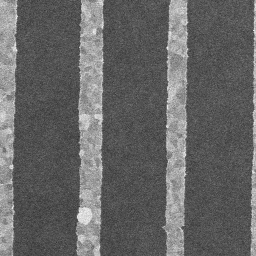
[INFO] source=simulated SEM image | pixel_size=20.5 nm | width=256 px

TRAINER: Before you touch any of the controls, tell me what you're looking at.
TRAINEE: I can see one or a few lines or trenches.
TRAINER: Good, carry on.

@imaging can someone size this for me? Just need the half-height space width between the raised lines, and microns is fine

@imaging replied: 1.37